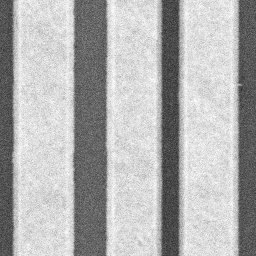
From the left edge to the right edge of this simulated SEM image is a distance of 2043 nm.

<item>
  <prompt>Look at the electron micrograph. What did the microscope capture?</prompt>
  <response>one or a few lines or trenches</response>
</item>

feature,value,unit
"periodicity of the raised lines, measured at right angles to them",82.5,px